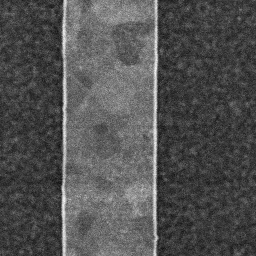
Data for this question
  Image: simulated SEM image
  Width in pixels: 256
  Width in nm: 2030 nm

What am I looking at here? one or a few lines or trenches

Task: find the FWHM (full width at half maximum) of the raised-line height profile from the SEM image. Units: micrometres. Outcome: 0.725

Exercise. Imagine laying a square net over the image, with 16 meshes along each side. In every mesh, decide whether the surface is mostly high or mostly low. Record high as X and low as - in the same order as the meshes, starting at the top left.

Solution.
----XXXXXX------
----XXXXXX------
----XXXXXX------
----XXXXXX------
----XXXXXX------
----XXXXXX------
----XXXXXX------
----XXXXXX------
----XXXXXX------
----XXXXXX------
----XXXXXX------
----XXXXXX------
----XXXXXX------
----XXXXXX------
----XXXXXX------
----XXXXXX------